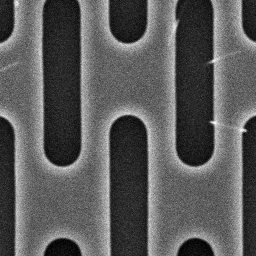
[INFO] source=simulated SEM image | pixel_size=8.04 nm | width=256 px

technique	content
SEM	groups of lines, slits or small figures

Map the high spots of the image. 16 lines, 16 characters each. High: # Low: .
.##..##..##..##.
.##..##..##..##.
###..##..##..###
###..######..###
###..######..###
###..######..###
###..######..###
###..##..##..###
.##..##..##..##.
.##..##..##..##.
.######..######.
.######..######.
.######..######.
.######..######.
.######..######.
.##..##..##..##.